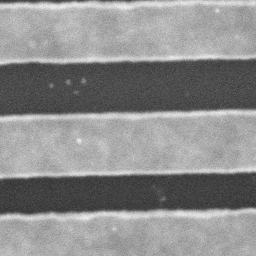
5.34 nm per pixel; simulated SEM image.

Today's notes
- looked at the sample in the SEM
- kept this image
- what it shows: lines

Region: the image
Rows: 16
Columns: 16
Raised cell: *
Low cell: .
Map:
****************
****************
****************
****************
................
................
................
****************
****************
****************
****************
................
................
****************
****************
****************